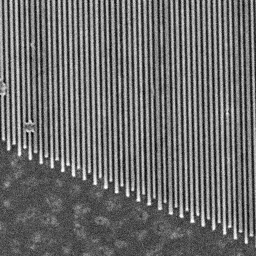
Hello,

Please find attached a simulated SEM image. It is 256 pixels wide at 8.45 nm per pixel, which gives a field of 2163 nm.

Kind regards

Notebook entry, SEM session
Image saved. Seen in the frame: parallel lines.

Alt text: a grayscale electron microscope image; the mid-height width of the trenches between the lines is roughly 0.0253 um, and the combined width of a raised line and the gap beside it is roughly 45.2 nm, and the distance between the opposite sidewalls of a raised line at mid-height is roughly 16.9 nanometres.